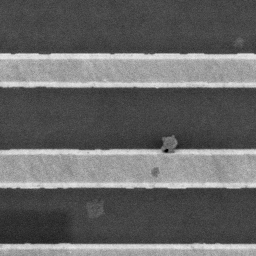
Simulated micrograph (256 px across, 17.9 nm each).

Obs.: lines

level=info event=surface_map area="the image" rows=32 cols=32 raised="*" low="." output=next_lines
................................
................................
................................
................................
................................
................................
................................
********************************
********************************
********************************
********************************
................................
................................
................................
................................
................................
................................
....................**..........
....................**..........
********************************
********************************
********************************
********************************
................................
................................
................................
................................
................................
................................
................................
................................
********************************